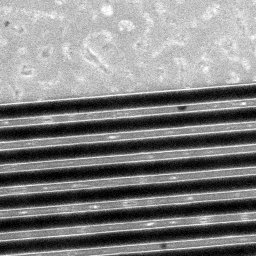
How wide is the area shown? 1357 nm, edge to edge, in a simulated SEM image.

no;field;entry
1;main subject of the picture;parallel lines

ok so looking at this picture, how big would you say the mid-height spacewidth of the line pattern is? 37 nm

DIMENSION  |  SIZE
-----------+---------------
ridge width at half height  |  83.2 nm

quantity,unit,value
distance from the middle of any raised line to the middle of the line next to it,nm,120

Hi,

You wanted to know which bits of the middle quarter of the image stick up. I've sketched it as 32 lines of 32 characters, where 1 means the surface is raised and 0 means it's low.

00000000000000000000000000000000
00000000000000000000000000000000
00000000000000000000000000000000
00000000000000000000000000000000
00000000000000000000000000000000
00000000000000000000000000000000
00000000000000000000000000000111
00000000000000000111111111111111
00001111111111111111111111111111
11111111111111111111111111111111
11111111111111111111111111000000
11111111111111000000000000000000
11000000000000000000000001111111
00000000000001111111111111111111
01111111111111111111111111111111
11111111111111111111111111111111
11111111111111111111110000000000
11111111110000000000000000000000
00000000000000000000001111111111
00000000011111111111111111111111
11111111111111111111111111111111
11111111111111111111111111111110
11111111111111111110000000000000
11111100000000000000000000000011
00000000000000000011111111111111
00011111111111111111111111111111
11111111111111111111111111111111
11111111111111111111111111100000
11111111111111100000000000000000
11100000000000000000000000111111
00000000000000111111111111111111
00111111111111111111111111111111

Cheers